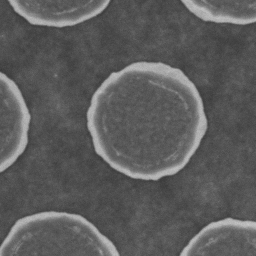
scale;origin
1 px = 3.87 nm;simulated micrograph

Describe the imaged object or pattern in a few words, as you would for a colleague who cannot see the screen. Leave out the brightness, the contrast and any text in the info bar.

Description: raised bodies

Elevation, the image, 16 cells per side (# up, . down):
.#####......####
...#............
................
................
........###.....
#.....######....
#.....#######...
##....#######...
##....######....
#.....######....
.......####.....
................
................
..###...........
.#####.......###
#######.....####